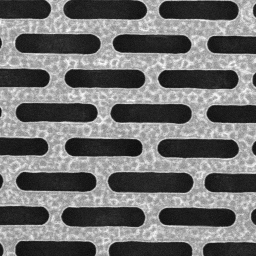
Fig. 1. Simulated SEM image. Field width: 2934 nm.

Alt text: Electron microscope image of a regular array of holes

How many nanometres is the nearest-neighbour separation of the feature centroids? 668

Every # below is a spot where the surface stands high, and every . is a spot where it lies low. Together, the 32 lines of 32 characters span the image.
......##..........##.........###
......##..........##..........##
##############...##########..###
################################
##..........###........####...##
##...........#..........##......
###.........###........###......
################################
..##############################
......##..........##..........##
......##..........##..........##
################################
################################
##..........##..........##......
##..........##..........##......
######################.#########
################################
......###........###.........###
......##..........##..........#.
##.######........###.........###
################################
#####...#######.......##########
##..........#...........##......
##..........##..........##......
################################
################################
......##..........##.........###
......##..........##.........##.
################################
################################
##..........##..........##......
##..........##..........#.......